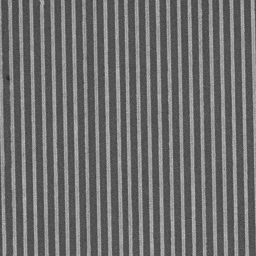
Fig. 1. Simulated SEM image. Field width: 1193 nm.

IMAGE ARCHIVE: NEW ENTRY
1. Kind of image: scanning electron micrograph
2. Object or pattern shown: parallel lines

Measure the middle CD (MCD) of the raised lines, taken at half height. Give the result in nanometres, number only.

12.2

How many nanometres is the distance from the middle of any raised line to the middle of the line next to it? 49.1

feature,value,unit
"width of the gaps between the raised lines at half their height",7.75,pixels